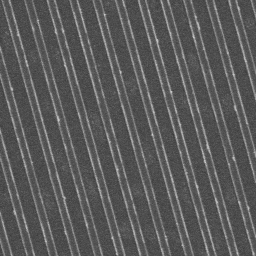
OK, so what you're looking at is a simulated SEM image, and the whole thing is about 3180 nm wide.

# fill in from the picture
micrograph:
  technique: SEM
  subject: parallel lines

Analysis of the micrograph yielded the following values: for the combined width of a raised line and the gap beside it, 271 nm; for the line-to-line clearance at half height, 14 pixels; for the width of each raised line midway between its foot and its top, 92.8 nm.